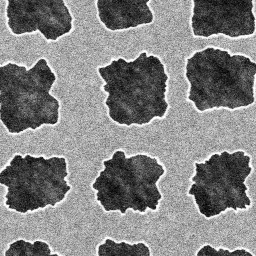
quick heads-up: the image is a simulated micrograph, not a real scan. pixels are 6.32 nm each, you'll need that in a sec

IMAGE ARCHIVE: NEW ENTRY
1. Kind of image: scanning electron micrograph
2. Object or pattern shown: holes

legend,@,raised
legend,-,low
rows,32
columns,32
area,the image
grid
@-------@@@@------@@@@@@--------
@--------@@@-------@@@@@--------
@--------@@@@------@@@@@--------
@--------@@@@---@@@@@@@@--------
@@@@@---@@@@@@@@@@@@@@@@@-@@@-@@
@@@@@@@@@@@@@@@@@@@@@@@@@@@@@@@@
@@@@@@@@@@@@@@@@@@@@@@@@@---@@@@
@@@@@@@@@@@@@@--@---@@@@-------@
---@--@@@@@@@--------@@---------
-------@@@@@@--------@@---------
-------@@@@@@--------@@@--------
------@@@@@@@--------@@@--------
-------@@@@@@--------@@@--------
-------@@@@@@@-------@@@@--@--@@
-------@@@@@@@------@@@@@@@@@@@@
-------@@@@@@@@---@@@@@@@@@@@@@@
@-@@@@@@@@@@@@@@@@@@@@@@@@@@@@@@
@@@@@@@@@@@@@@@@@@@@@@@@@@@@@@@@
@@@@@@@@@@@@@@@@@@@@@@@@@@@@@@@@
@@--@@@@@@@@@@--@--@@@@@@@-----@
@-------@@@@@-------@@@@@------@
--------@@@@@-------@@@@-------@
--------@@@@--------@@@@-------@
@--------@@@--------@@@@-------@
@-------@@@@--------@@@@-------@
@------@@@@@@-------@@@@-------@
@@-@@@@@@@@@@@@-@@@@@@@@@---@@@@
@@@@@@@@@@@@@@@@@@@@@@@@@@@@@@@@
@@@@@@@@@@@@@@@@@@@@@@@@@@@@@@@@
@@@@@@@@@@@@@@@@@@@@@@@@@@@@@@@@
@-----@@@@@@@-----@@@@@@@@@@@@@@
@------@@@@@-------@@@@@@------@